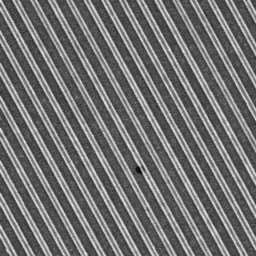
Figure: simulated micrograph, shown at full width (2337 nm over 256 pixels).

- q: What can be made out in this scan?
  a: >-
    parallel lines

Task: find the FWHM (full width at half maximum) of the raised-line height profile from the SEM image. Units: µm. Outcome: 0.043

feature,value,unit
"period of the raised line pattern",142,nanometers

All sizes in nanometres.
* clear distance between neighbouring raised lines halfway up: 104